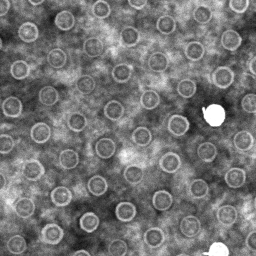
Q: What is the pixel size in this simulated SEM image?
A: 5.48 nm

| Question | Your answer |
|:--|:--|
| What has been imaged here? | a regular array of raised bodies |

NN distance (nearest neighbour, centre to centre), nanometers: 207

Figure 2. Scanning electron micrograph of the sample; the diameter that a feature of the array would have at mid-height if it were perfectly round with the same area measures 105 nm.